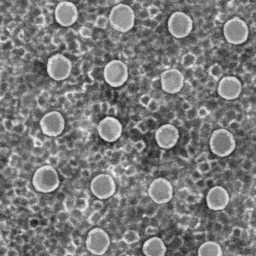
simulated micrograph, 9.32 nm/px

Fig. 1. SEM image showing a regular array of raised bodies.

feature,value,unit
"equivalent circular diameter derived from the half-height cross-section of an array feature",220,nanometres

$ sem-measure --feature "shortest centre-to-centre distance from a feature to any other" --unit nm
516